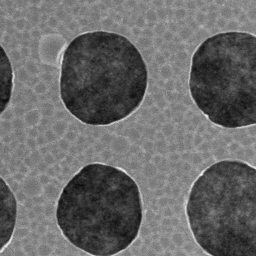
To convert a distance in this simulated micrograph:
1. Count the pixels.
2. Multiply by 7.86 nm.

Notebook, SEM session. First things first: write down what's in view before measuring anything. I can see holes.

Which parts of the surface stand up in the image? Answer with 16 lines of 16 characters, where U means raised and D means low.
UUUUUUUUUUUUUUUU
UUUUUUUUUUUUUUUU
UUUUUDDDUUUUUDDD
UUUUDDDDDUUUDDDD
DUUUDDDDDUUUDDDD
DUUUDDDDDUUUDDDD
UUUUDDDDDUUUDDDD
UUUUUDDUUUUUUDDD
UUUUUUUUUUUUUUUU
UUUUUUUUUUUUUUUU
UUUUUDDUUUUUUDDD
UUUUDDDDUUUUDDDD
DUUUDDDDDUUUDDDD
DUUUDDDDDUUUDDDD
DUUUDDDDDUUUDDDD
UUUUUDDDUUUUUDDD